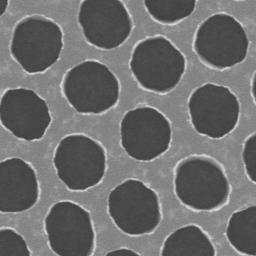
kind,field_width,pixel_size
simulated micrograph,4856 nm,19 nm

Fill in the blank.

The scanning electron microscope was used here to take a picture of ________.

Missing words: a regular array of holes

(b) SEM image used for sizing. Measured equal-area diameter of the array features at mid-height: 1000 nm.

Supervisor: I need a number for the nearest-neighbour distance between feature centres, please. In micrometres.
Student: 1.32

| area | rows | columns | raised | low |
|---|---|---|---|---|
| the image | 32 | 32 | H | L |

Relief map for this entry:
LHHHHHHHHHLLLLLHHHLLLLLLHHHHHHHH
LHHHHHHHHHLLLLLLHHHLLLLLHHHHHHHH
HHHLLLHHHHLLLLLLHHHHLLHHHHLLLHHH
HHLLLLLHHHLLLLLLHHHHHHHHHLLLLLHH
HHLLLLLLHHHLLLLLHHHHHHHHHLLLLLLH
HLLLLLLLHHHHLLLHHLLLLHHHLLLLLLLH
HLLLLLLLHHHHHHHHHLLLLLHHHLLLLLLH
HHLLLLLHHHHHHHHHLLLLLLLHHLLLLLHH
HHHLLLHHHLLLLHHHLLLLLLLHHHHHHHHH
HHHHHHHHLLLLLLHHHLLLLLLHHHHHHHHH
HHHHHHHHLLLLLLLHHHLLLLHHHHHHHHHH
HLLLHHHHLLLLLLLHHHHHHHHHLLLLLHHH
LLLLLHHHHLLLLLLHHHHHHHHHLLLLLLHH
LLLLLLHHHLLLLLHHHLLHHHHHLLLLLLHH
LLLLLLHHHHHHHHHHLLLLHHHHLLLLLLHH
LLLLLLHHHHHHHHHLLLLLLHHHLLLLLHHH
HLLLLLHHHHHHHHHLLLLLLHHHHLLLLHHH
HHHLHHHHLLLLHHHLLLLLLHHHHHHHHHHL
HHHHHHHLLLLLLHHLLLLLLHHHHHHHHHHL
HHHHHHHLLLLLLHHHLLLLHHHHHHHHHHLL
LLLHHHHLLLLLLHHHHHHHHHHLLLLHHHHL
LLLLHHHLLLLLLHHHHHHHHHLLLLLLHHHL
LLLLLHHHLLLLHHHHLHHHHHLLLLLLHHHH
LLLLLHHHHLLHHHLLLLLHHHLLLLLLLHHH
LLLLLHHHHHHHHHLLLLLLHHLLLLLLHHHH
LLLLHHHLLHHHHHLLLLLLHHHLLLLLHHHH
LLHHHHLLLLLHHHLLLLLLHHHHHHHHHHLL
HHHHHHLLLLLHHHLLLLLLHHHHHHHHHLLL
HHHHHHLLLLLHHHHLLLLHHHHLLHHHLLLL
LLLHHHLLLLLLHHHHHHHHHLLLLLHHLLLL
LLLHHHLLLLLLHHHHHHHHHLLLLLHHHLLL
LLLLHHHLLLLHHHLLLHHHLLLLLLLHHHLL